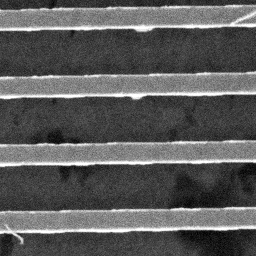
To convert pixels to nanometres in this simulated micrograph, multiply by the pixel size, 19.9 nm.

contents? lines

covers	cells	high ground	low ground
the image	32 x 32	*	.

................................
********************************
********************************
***********.....................
................................
................................
................................
................................
................................
..........**********************
********************************
********************************
................................
................................
................................
................................
................................
................................
********************************
********************************
**********......................
................................
................................
................................
................................
................................
.......*************************
********************************
********************************
................................
................................
................................